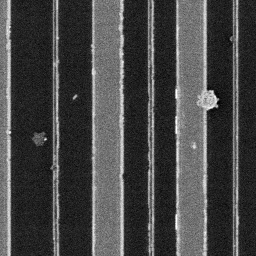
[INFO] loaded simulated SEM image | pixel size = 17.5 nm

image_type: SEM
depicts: lines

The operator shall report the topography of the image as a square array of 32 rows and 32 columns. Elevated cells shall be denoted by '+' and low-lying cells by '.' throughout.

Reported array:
+...........+++.......++++......
+...........+++.......++++......
+...........+++.......++++......
+...........+++.......++++......
+...........+++.......++++...+..
+...........+++.......++++...+..
+...........+++.......++++......
+...........+++.......++++......
+...........+++.......++++......
+...........+++.......++++......
+...........+++.......++++......
+...........+++.......+++++.....
+...........+++.......+++++.....
+...........+++.......++++......
+...........+++.......++++......
+...........+++.......++++......
+...........+++.......++++......
+...........+++.......++++......
+...........+++.......++++......
+...........+++.......++++......
+...........+++.......++++......
+...........+++.......++++......
+...........+++.......++++......
+...........+++.......++++......
+...........+++.......++++......
+...........+++.......++++......
+...........+++.......++++......
+...........+++.......++++......
+...........+++.......++++......
+...........+++.......++++......
+...........+++.......++++......
+...........+++.......++++......